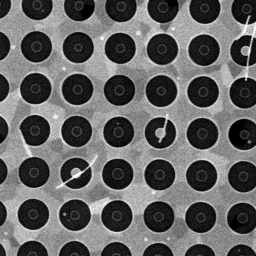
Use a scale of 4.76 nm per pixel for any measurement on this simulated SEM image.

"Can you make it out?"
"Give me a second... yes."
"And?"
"an array of small figures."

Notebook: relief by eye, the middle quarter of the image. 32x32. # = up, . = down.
################################
################################
##...###########################
......#####.....######.....#####
.......###.......####.......###.
.......###........##........###.
.......###........##.........##.
.......###........##........###.
.......###.......####.......###.
#.....#####.....#####......#####
#############.########....######
################################
################################
#....#######...#######...#######
......#####......####......#####
.......###.......###........###.
.......###........##........###.
.......###........##........##..
.......###.......###........###.
......####.......####......####.
#....######....#######....######
################################
################################
##...###########################
......#####.....######....######
......####.......####......####.
.......###.......###........###.
.......##.........##........##..
.......##........###........##..
......####.......###........###.
......#####.....#####......####.
#############.#########..#######